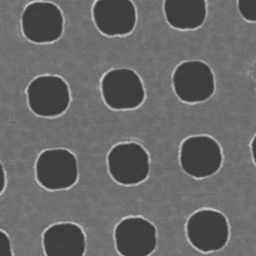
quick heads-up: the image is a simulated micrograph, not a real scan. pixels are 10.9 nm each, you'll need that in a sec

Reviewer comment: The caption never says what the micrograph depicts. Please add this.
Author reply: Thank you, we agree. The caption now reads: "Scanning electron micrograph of a regular array of holes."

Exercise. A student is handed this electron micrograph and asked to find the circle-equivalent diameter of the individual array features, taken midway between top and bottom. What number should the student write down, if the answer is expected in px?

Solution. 41.4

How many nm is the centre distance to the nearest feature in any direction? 788